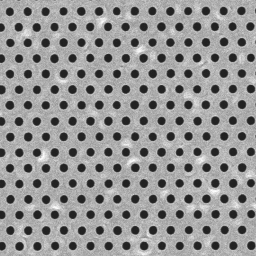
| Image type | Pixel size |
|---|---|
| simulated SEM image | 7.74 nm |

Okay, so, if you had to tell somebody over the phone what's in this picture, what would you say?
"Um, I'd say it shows a regular array of holes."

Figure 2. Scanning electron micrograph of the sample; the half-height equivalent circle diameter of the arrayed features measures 68.2 nanometres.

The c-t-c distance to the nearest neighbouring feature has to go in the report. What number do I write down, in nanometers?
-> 135